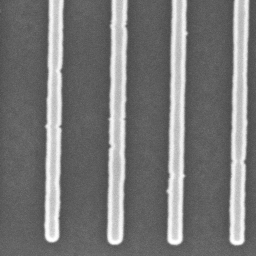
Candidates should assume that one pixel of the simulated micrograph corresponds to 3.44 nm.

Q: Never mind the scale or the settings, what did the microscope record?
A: one or a few lines or trenches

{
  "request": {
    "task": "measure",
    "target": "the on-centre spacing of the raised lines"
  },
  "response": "212 nanometres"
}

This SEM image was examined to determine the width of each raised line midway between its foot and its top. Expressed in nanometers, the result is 39.1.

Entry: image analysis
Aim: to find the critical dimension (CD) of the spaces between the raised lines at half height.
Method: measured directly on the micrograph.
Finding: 175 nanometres